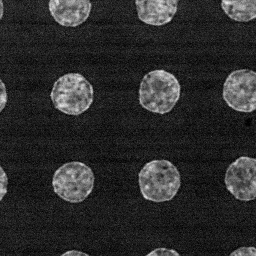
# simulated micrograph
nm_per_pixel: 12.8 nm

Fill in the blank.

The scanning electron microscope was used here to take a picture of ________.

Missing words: raised bodies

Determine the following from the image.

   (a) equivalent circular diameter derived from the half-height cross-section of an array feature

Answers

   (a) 0.517 um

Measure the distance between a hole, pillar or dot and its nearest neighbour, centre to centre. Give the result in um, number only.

1.11